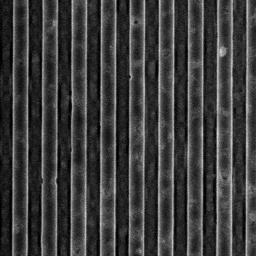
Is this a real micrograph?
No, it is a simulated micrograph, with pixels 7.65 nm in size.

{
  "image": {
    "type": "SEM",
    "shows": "parallel lines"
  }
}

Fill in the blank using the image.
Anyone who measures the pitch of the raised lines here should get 223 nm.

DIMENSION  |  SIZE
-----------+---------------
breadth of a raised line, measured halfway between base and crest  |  110 nm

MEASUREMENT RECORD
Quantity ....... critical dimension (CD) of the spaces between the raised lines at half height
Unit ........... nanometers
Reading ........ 109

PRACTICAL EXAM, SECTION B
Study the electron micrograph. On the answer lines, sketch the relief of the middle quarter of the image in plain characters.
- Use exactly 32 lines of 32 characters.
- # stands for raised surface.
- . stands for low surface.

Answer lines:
..###....####....###....###....#
..###....####....###....###....#
..###....####....###....###....#
..###....####....###....###....#
..###....####....###....###....#
..###....####....###....###....#
..###....####....###....###....#
..###....####....###....###....#
..###....####....###....###....#
..###....####....###....###....#
..###....####....###....###....#
..###....####....###....###....#
..###....####....###....###....#
..###....####....###....###....#
..###....####....###....###....#
..###....####....###....###....#
..###....####....###....###....#
..###....####....###....###....#
..###....####....###....###....#
..###....####....###....###....#
..###....####....###....###....#
..###....####....###....###....#
..###....####....###....###....#
..###....####....###....###....#
..###....####....###....###....#
..###....####....###....###....#
..###....####....###....###....#
..###....####....###....###....#
..###....####....###....###....#
..###....####....###....###....#
..###....####....###....###....#
..###....####....###....###....#